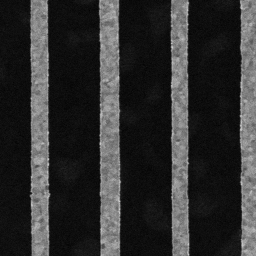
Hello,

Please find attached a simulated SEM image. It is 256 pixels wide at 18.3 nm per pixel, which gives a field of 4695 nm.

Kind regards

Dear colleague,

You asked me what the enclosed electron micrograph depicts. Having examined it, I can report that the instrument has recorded one or a few lines or trenches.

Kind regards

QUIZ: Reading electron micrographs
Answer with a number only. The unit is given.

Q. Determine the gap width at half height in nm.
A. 975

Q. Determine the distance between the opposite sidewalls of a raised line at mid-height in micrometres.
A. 0.296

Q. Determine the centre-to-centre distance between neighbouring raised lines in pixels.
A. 69.6